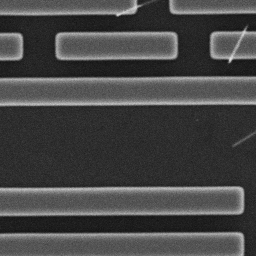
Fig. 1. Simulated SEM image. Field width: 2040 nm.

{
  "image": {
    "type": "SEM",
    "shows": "groups of lines, slits or small figures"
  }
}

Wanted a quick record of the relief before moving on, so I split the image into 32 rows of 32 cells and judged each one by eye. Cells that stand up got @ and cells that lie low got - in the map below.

@@@@@@@@@@@@@@@@@----@@@@@@@@@@@
@@@@@@@@@@@@@@@@@-----@@@@@@@@@@
--------------------------------
--------------------------------
@@@----@@@@@@@@@@@@@@@----@@@@@@
@@@----@@@@@@@@@@@@@@@----@@@@@@
@@@----@@@@@@@@@@@@@@@----@@@@@@
--------------------------------
--------------------------------
--------------------------------
@@@@@@@@@@@@@@@@@@@@@@@@@@@@@@@@
@@@@@@@@@@@@@@@@@@@@@@@@@@@@@@@@
@@@@@@@@@@@@@@@@@@@@@@@@@@@@@@@@
--------------------------------
--------------------------------
--------------------------------
--------------------------------
--------------------------------
--------------------------------
--------------------------------
--------------------------------
--------------------------------
--------------------------------
----------------------@@@@@@@@--
@@@@@@@@@@@@@@@@@@@@@@@@@@@@@@--
@@@@@@@@@@@@@@@@@@@@@@@@@@@@@@--
@@@@@@@@@@@@@@@@@@@@@@@@@@@@@@--
--------------------------------
--------------------------------
@@@@@@@@@@@@@@@@@@@@@@@@@@@@@@--
@@@@@@@@@@@@@@@@@@@@@@@@@@@@@@--
@@@@@@@@@@@@@@@@@@@@@@@@@@@@@@--